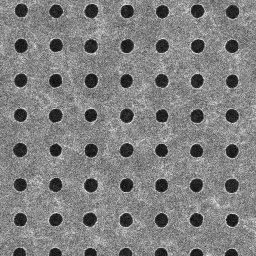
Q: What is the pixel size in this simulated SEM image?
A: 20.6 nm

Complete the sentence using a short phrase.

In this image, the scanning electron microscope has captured a regular array of holes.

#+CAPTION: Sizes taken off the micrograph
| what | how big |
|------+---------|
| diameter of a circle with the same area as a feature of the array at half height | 282 nm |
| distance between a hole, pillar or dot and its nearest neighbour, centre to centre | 34.5 px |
